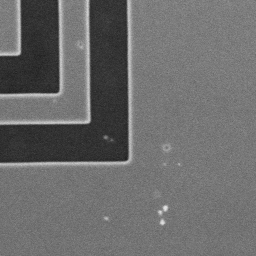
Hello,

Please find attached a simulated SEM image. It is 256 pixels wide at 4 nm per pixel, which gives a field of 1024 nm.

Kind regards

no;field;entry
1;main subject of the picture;groups of lines, slits or small figures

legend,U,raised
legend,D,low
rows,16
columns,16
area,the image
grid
UDDDUUDDUUUUUUUU
UDDDUUDDUUUUUUUU
UDDDUUDDUUUUUUUU
DDDDUUDDUUUUUUUU
DDDDUUDDUUUUUUUU
DDDDUUDDUUUUUUUU
UUUUUUDDUUUUUUUU
UUUUUDDDUUUUUUUU
DDDDDDDDUUUUUUUU
DDDDDDDDUUUUUUUU
UUUUUUUUUUUUUUUU
UUUUUUUUUUUUUUUU
UUUUUUUUUUUUUUUU
UUUUUUUUUUUUUUUU
UUUUUUUUUUUUUUUU
UUUUUUUUUUUUUUUU